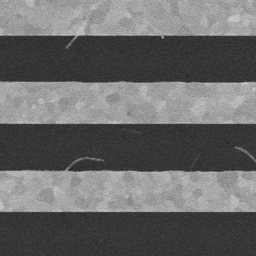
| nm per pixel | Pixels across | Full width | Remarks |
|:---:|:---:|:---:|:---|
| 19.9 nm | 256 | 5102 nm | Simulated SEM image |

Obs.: lines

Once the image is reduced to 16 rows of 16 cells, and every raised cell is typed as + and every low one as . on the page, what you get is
++++++++++++++++
++++++++++++++++
................
................
................
++++++++++++++++
++++++++++++++++
++++++++++++++++
................
................
................
++++++++++++++++
++++++++++++++++
................
................
................